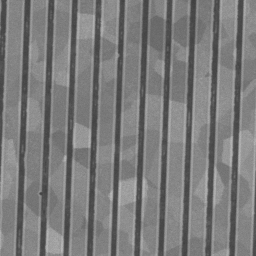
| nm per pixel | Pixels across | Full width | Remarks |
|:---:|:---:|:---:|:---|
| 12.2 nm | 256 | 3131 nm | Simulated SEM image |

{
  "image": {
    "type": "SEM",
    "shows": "parallel lines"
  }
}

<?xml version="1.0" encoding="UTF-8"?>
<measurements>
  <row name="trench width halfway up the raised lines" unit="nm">93.2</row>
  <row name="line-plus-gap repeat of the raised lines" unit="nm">289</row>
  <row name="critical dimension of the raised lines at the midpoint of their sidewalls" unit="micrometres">0.197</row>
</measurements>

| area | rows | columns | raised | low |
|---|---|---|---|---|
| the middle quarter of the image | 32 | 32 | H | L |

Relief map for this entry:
HLLHHHHLLHHHHLLHHHHLLHHHHLLHHHHL
HLLHHHHLLHHHHLLHHHHLLHHHHLLHHHHL
HLLHHHHLLHHHHLLHHHHLLHHHHLLHHHHL
HLLHHHHLLHHHHLLHHHHLLHHHHLLHHHHL
HLLHHHHLLHHHHLLHHHHLLHHHHLLHHHHL
HLLHHHHLLHHHHLLHHHHLLHHHHLLHHHLL
HLLHHHHLLHHHHLLHHHHLLHHHLLLHHHLL
HLLHHHHLLHHHHLLHHHHLLHHHLLLHHHLL
HLLHHHHLLHHHHLLHHHHLLHHHLLLHHHLL
HLLHHHHLLHHHHLLHHHHLLHHHLLLHHHLL
HLLHHHHLLHHHHLLHHHHLLHHHHLHHHHLL
HLLHHHHLLHHHHLLHHHLLLHHHHLHHHHLL
HLLHHHHLLHHHHLLHHHLLHHHHLLHHHHLL
HLLHHHHLLHHHHLLHHHLLHHHHLLHHHHLL
HLLHHHHLLHHHHLHHHHLLHHHHLLHHHHLL
HLLHHHHLLHHHHLHHHHLLHHHHLLHHHHLL
HLLHHHHLLHHHLLHHHHLLHHHHLLHHHHLL
HLLHHHHLLHHHLLHHHHLLHHHHLLHHHHLL
HLLHHHLLLHHHLLHHHHLLHHHHLLHHHHLL
HLLHHHLLLHHHLLHHHHLLHHHHLLHHHHLL
LLLHHHLLLHHHLLHHHHLLHHHHLLHHHHLL
LLLHHHLLLHHHLLHHHHLLHHHHLLHHHHLL
LLLHHHLLHHHHLLHHHHLLHHHHLLHHHHLL
LLHHHHLLHHHHLLHHHHLLHHHHLLHHHHLL
LLHHHHLLHHHHLLHHHHLLHHHHLLHHHHLL
LLHHHHLLHHHHLLHHHHLLHHHHLLHHHHLL
LLHHHHLLHHHHLLHHHHLLHHHHLLHHHHLL
LLHHHHLLHHHHLLHHHHLLHHHHLLHHHHLL
LLHHHHLLHHHHLLHHHHLLHHHHLLHHHHLL
LLHHHHLLHHHHLLHHHHLLHHHHLLHHHHLL
LLHHHHLLHHHHLLHHHHLLHHHHLLHHHHLL
LLHHHHLLHHHHLLHHHHLLHHHHLLHHHHLL